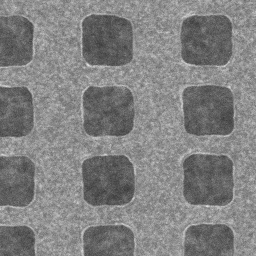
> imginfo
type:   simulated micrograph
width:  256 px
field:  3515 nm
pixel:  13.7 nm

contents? holes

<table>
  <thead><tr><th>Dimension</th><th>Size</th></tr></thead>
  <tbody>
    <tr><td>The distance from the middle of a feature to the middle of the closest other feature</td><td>955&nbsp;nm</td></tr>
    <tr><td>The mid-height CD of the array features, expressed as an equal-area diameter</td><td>0.765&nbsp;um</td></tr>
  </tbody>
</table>